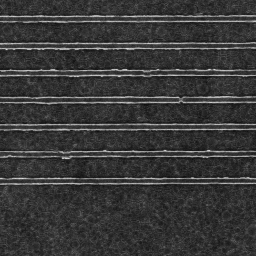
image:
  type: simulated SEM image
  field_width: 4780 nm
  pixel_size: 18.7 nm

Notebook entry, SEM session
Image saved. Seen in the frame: parallel lines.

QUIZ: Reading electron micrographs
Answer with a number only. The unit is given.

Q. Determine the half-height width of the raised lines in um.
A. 0.103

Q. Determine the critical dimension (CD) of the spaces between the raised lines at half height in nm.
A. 408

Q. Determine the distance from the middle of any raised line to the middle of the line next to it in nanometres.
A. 505